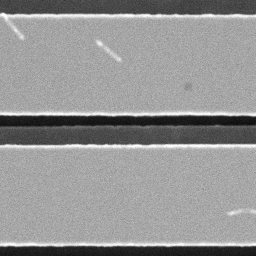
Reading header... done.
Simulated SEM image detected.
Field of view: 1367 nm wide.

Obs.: lines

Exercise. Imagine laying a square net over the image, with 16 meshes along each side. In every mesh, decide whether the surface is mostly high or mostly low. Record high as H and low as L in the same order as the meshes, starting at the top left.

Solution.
LLLLLLLLLLLLLLLL
HHHHHHHHHHHHHHHH
HHHHHHHHHHHHHHHH
HHHHHHHHHHHHHHHH
HHHHHHHHHHHHHHHH
HHHHHHHHHHHHHHHH
HHHHHHHHHHHHHHHH
LLLLLLLLLLLLLLLL
LLLLLLLLLLLLLLLL
HHHHHHHHHHHHHHHH
HHHHHHHHHHHHHHHH
HHHHHHHHHHHHHHHH
HHHHHHHHHHHHHHHH
HHHHHHHHHHHHHHHH
HHHHHHHHHHHHHHHH
LLLLLLLLLLLLLLLL